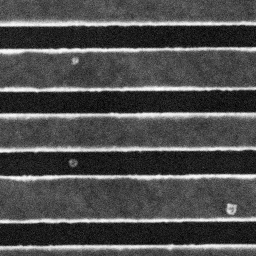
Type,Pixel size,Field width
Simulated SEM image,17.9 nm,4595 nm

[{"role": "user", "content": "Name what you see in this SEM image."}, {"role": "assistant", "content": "lines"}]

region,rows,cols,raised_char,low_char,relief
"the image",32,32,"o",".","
oooooooooooooooooooooooooooooooo
oooooooooooooooooooooooooooooooo
oooooooooooooooooooooooooooooooo
................................
................................
................................
oooooooooooooooooooooooooooooooo
oooooooooooooooooooooooooooooooo
oooooooooooooooooooooooooooooooo
oooooooooooooooooooooooooooooooo
oooooooooooooooooooooooooooooooo
................................
................................
................................
oooooooooooooooooooooooooooooooo
oooooooooooooooooooooooooooooooo
oooooooooooooooooooooooooooooooo
oooooooooooooooooooooooooooooooo
oooooooooooooooooooooooooooooooo
................................
................................
................................
oooooooooooooooooooooooooooooooo
oooooooooooooooooooooooooooooooo
oooooooooooooooooooooooooooooooo
oooooooooooooooooooooooooooooooo
oooooooooooooooooooooooooooooooo
oooooooooooooooooooooooooooooooo
................................
................................
................................
oooooooooooooooooooooooooooooooo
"